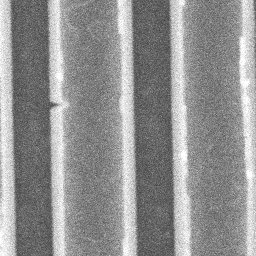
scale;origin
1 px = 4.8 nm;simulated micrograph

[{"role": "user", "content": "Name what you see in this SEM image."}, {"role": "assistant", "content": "one or a few lines or trenches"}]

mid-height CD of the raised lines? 360 nm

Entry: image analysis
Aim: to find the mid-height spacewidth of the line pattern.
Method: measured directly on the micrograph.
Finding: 0.226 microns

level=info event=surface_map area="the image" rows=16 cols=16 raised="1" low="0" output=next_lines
0001111100011111
0001111100011111
0001111100011111
0001111100011111
0001111100011111
0001111100011111
0000111100011111
0001111100011111
1001111100011111
1000111100011111
1001111100011111
1001111100011111
1000111100011111
1000111100011111
1000111100011111
1000111100011111